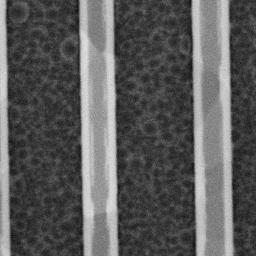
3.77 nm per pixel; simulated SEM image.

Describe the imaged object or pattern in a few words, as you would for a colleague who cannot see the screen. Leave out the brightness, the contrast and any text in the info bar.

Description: one or a few lines or trenches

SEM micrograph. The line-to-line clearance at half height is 81.6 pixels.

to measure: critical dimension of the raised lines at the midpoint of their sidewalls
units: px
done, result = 29.9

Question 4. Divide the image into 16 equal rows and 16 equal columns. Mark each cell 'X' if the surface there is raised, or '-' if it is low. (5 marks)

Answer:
-----XX-----XX--
-----XX-----XX--
-----XX-----XX--
-----XX-----XX--
-----XX-----XX--
-----XX-----XX--
-----XX-----XX--
-----XX-----XX--
-----XX-----XX--
-----XX-----XX--
-----XX-----XX--
-----XX-----XX--
-----XX-----XX--
-----XX-----XX--
-----XX-----XX--
-----XX-----XX--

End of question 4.